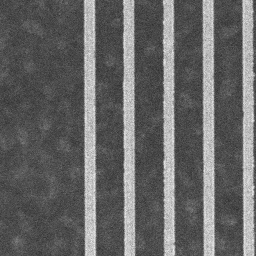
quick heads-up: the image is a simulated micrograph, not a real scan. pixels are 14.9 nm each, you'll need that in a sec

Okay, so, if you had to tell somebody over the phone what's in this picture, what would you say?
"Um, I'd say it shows parallel lines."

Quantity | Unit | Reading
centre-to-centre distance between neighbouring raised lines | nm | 589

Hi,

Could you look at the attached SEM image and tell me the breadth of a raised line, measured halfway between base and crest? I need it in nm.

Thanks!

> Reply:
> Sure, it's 132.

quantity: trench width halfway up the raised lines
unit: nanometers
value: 461